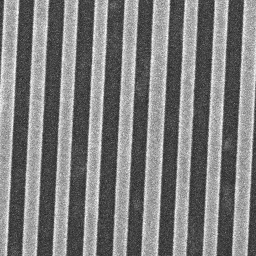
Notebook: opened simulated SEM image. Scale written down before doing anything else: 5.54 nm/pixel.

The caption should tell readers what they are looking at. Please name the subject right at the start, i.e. parallel lines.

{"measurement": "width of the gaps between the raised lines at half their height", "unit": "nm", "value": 92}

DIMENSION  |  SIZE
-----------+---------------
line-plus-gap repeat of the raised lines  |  0.166 micrometres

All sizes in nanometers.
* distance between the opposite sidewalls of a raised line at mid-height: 71.9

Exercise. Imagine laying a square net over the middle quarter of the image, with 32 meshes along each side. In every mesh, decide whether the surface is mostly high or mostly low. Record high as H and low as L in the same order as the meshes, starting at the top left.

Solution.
HHHLLLLHHHLLLLLHHHLLLLHHHLLLLLHH
HHHLLLLHHHLLLLLHHHLLLLHHHLLLLLHH
HHLLLLLHHHLLLLHHHHLLLLHHHLLLLLHH
HHLLLLLHHHLLLLHHHLLLLLHHHLLLLHHH
HHLLLLLHHHLLLLHHHLLLLLHHHLLLLHHH
HHLLLLLHHHLLLLHHHLLLLLHHHLLLLHHH
HHLLLLLHHHLLLLHHHLLLLHHHHLLLLHHH
HHLLLLLHHHLLLLHHHLLLLHHHHLLLLHHH
HHLLLLLHHHLLLLHHHLLLLHHHHLLLLHHH
HHLLLLLHHHLLLLHHHLLLLHHHHLLLLHHH
HHLLLLLHHHLLLLHHHLLLLHHHHLLLLHHH
HHLLLLLHHLLLLLHHHLLLLHHHHLLLLHHH
HHLLLLLHHLLLLLHHHLLLLHHHHLLLLHHH
HHLLLLLHHLLLLLHHHLLLLHHHHLLLLHHH
HHLLLLLHHLLLLLHHHLLLLHHHHLLLLHHH
HHLLLLHHHLLLLLHHHLLLLHHHHLLLLHHH
HHLLLLHHHLLLLLHHHLLLLHHHHLLLLHHH
HHLLLLHHHLLLLLHHHLLLLHHHHLLLLHHH
HHLLLLHHHLLLLLHHHLLLLHHHHLLLLHHH
HHLLLLHHHLLLLLHHHLLLLHHHHLLLLHHH
HHLLLLHHHLLLLLHHHLLLLHHHHLLLLHHH
HHLLLLHHHLLLLLHHHLLLLHHHLLLLLHHH
HHLLLLHHHLLLLLHHHLLLLHHHLLLLLHHH
HLLLLLHHHLLLLHHHHLLLLHHHLLLLLHHH
HLLLLLHHHLLLLHHHLLLLLHHHLLLLHHHH
HLLLLLHHHLLLLHHHLLLLLHHHLLLLHHHL
HLLLLLHHHLLLLHHHLLLLLHHHLLLLHHHL
HLLLLLHHHLLLLHHHLLLLHHHHLLLLHHHL
HLLLLLHHHLLLLHHHLLLLHHHHLLLLHHHL
HLLLLLHHHLLLLHHHLLLLHHHHLLLLHHHL
HLLLLLHHHLLLLHHHLLLLHHHHLLLLHHHL
HLLLLLHHHLLLLHHHLLLLHHHHLLLLHHHL